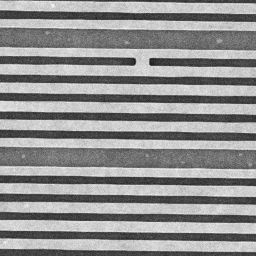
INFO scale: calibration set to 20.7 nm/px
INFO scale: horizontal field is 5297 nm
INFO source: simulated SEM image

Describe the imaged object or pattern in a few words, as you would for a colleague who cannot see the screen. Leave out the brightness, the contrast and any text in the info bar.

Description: groups of lines, slits or small figures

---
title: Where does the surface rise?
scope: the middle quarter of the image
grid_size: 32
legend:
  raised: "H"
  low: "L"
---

HHHHHHHHHHHHHHHHHHHHHHHHLLLLLLLL
HHHHHHHHHHHHHHHHHHHHHHHHHHHHHHHH
HHHHHHHHHHHHHHHHHHHHHHHHHHHHHHHH
LLLLLLLLLLLLLLLLLLLLLLLLLLLLLLLL
LLLLLLLLLLLLLLLLLLLLLLLLLLLLLLLL
HHHHHHHHHHHHHHHHHHHHHHHHHHHHHHHH
HHHHHHHHHHHHHHHHHHHHHHHHHHHHHHHH
LLLLLLLLLLLLLLLLLLHHHHHHHHHHHHHH
LLLLLLLLLLLLLLLLLLLLLLLLLLLLLLLL
LLLLLLLLLLLLLLLLLLLLLLLLLLLLLLLL
HHHHHHHHHHHHHHHHHHHHHHHHHHHHHHHH
HHHHHHHHHHHHHHHHHHHHHHHHHHHHHHHH
LLLLLLLLLLLLLLLLLLLLLLLLLLLLLLLL
LLLLLLLLLLLLLLLLLLLLLLLLLLLLLLLL
HHHHHHHHHHHHHHHHHHHHHLLLLLLLLLLL
HHHHHHHHHHHHHHHHHHHHHHHHHHHHHHHH
LLHHHHHHHHHHHHHHHHHHHHHHHHHHHHHH
LLLLLLLLLLLLLLLLLLLLLLLLLLLLLLLL
LLLLLLLLLLLLLLLLLLLLLLLLLLLLLLLL
HHHHHHHHHHHHHHHHHHHHHHHHHHHHHHHH
HHHHHHHHHHHHHHHHHHHHHHHHHHHHHHHH
LLLLLLLLLLLLLLLLLLLLLLLLLLLLLLLL
LLLLLLLLLLLLLLLLLLLLLLLLLLLLLLLL
LLLLLLLLLLLLLLLLLLLLLLLLLLLLLLLL
LLLLLLLLLLLLLLLLLLLLLLLLLLLLLLLL
LLLLLLLLLLLLLLLLLLLLLLLLLLLLLLLL
HHHHHHHHHHHHHHHHHHHHHHHHHHHHHHHH
HHHHHHHHHHHHHHHHHHHHHHHHHHHHHHHH
LLLLLLLLLLLLLLLLLLLLLLLLLLLLLLLL
LLLLLLLLLLLLLLLLLLLLLLLLLLLLLLLL
HHHHHHHHHHHHHHHHHHHHHHHHHHHHHHLL
HHHHHHHHHHHHHHHHHHHHHHHHHHHHHHHH